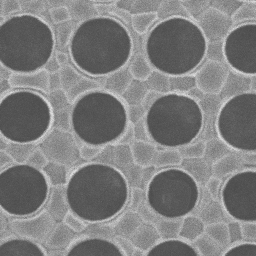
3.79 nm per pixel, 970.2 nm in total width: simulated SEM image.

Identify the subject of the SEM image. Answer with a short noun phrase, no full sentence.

holes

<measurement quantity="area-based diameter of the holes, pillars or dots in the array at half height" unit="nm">209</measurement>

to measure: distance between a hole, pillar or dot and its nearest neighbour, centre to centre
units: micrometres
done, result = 0.278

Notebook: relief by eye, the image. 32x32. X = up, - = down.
XXXXXXXXXXXXXXXXXXXXXXXXXXXXXXXX
XXXXXXXXXXXXXXXXXXXXXXXXXXXXXXXX
X----XXXXXX---XXXXXXX--XXXXXXXXX
------XXXX-----XXXX------XXXXX--
------XXX-------XXX------XXXX---
-------XX-------XX--------XX----
------XXX-------XX--------XX----
------XXX-------XXX------XXX----
X----XXXXX-----XXXXX----XXXXX---
XXXXXXXXXXXXXXXXXXXXXXXXXXXXXXXX
XXXXXXXXXXXXXXXXXXXXXXXXXXXXXXXX
XXXXXXXXXXXXXXXXXXXXXXXXXXXXXXXX
-----XXXXX-----XXXXX----XXXXX---
------XXX------XXXX------XXX----
------XXX-------XX-------XX-----
------XXX-------XX-------XX-----
------XXX------XXXX------XXX----
X---XXXXXX----XXXXX-----XXXX----
XXXXXXXXXXXXXXXXXXXXXXXXXXXXXX--
XXXXXXXXXXXXXXXXXXXXXXXXXXXXXXXX
XXXXXXXXXXXXXXXXXXXXXXXXXXXXXXXX
-----XXXXX-----XXXXX---XXXXXXXXX
------XXX-------XXX-----XXXXX---
------XX--------XXX------XXX----
------XX--------XXX------XXX----
-----XXXX------XXXX-----XXXX----
X---XXXXX------XXXXX----XXXXX---
XXXXXXXXXXX--XXXXXXXXXXXXXXXXX--
XXXXXXXXXXXXXXXXXXXXXXXXXXXXXXXX
XXXXXXXXXXXXXXXXXXXXXXXXXXXXXXXX
----XXXXXX----XXXXXX---XXXXXXXXX
-----XXXX------XXXX-----XXXXX---